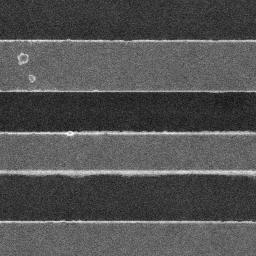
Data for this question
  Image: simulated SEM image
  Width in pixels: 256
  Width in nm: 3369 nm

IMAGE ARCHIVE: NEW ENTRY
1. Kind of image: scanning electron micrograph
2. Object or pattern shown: lines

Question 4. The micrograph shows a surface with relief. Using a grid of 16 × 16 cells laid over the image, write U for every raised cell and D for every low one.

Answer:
DDDDDDDDDDDDDDDD
DDDDDDDDDDDDDDDD
DDDDDDDDDDDDDDDD
UUUUUUUUUUUUUUUU
UUUUUUUUUUUUUUUU
UUUUUUUUUUUUUUUU
DDDDDDDDDDDDDDDD
DDDDDDDDDDDDDDDD
UUUUUUUUUUUUUUUU
UUUUUUUUUUUUUUUU
UUUUUUUUUUUUUUUU
DDDDDDDDDDDDDDDD
DDDDDDDDDDDDDDDD
DDDDDDDDDDDDDDDD
UUUUUUUUUUUUUUUU
UUUUUUUUUUUUUUUU